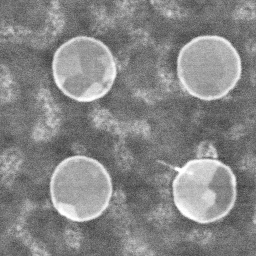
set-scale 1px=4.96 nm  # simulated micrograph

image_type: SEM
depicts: raised bodies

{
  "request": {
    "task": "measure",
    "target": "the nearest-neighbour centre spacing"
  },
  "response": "121 pixels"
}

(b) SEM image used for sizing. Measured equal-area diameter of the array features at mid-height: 309 nanometres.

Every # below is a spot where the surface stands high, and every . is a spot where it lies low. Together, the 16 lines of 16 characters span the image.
................
................
....##......##..
...####....####.
...####....####.
....###.....##..
................
................
................
................
....##......##..
...####....####.
...####....####.
....##......##..
................
................